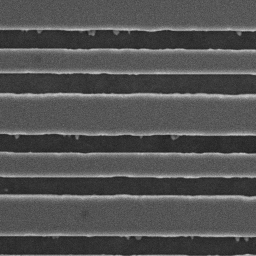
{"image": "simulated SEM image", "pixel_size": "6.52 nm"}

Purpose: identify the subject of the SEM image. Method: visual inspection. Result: lines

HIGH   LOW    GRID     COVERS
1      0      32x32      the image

11111111111111111111111111111111
11111111111111111111111111111111
11111111111111111111111111111111
11111111111111111111111111111111
00000000000000000000000000000000
00000000000000000000000000000000
11111111111111111111111111111111
11111111111111111111111111111111
11111111111111111111111111111111
00000000000000000000000000000000
00000000000000000000000000000000
00000000000000000000000000000000
11111111111111111111111111111111
11111111111111111111111111111111
11111111111111111111111111111111
11111111111111111111111111111111
11111111111111111111111111111111
00000000000000000000000000000000
00000000000000000000000000000000
11111111111111111111111111111111
11111111111111111111111111111111
11111111111111111111111111111111
00000000000000000000000000000000
00000000000000000000000000000000
11111111111111111111111111111110
11111111111111111111111111111111
11111111111111111111111111111111
11111111111111111111111111111111
11111111111111111111111111111111
00000100000100010011111101111111
00000000000000000000000000000000
00000000000000000000000000000000